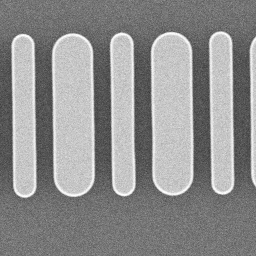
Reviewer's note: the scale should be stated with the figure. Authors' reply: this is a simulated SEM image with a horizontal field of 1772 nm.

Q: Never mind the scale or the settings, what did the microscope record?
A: groups of lines, slits or small figures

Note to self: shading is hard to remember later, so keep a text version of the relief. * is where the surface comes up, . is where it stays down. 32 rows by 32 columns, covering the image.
................................
................................
................................
................................
..*.....**....**....***....**...
..**...****...***..*****..***..*
..**...*****..***..*****..***..*
..**...*****..***..*****..***..*
..**...*****..***..*****..***..*
..**...*****..***..*****..***..*
..**...*****..***..*****..***..*
..**...*****..***..*****..***..*
..**...*****..***..*****..***..*
..**...*****..***..*****..***..*
..**...*****..***..*****..***..*
..**...*****..***..*****..***..*
..**...*****..***..*****..***..*
..**...*****..***..*****..***..*
..**...*****..***..*****..***..*
..**...*****..***..*****..***..*
..**...*****..***..*****..***..*
..**...*****..***..*****..***...
..**...*****..***..*****...**...
..**...****...***...***....**...
...*............................
................................
................................
................................
................................
................................
................................
................................